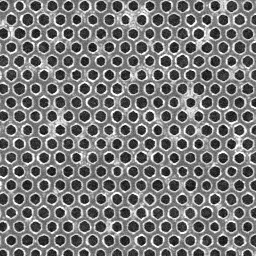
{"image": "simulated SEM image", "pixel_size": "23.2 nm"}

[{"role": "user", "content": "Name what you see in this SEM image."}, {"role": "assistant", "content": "a regular array of holes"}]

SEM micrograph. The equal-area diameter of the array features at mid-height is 247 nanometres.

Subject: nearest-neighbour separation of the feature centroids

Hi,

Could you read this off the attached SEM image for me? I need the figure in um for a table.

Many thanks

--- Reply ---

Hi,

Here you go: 0.368